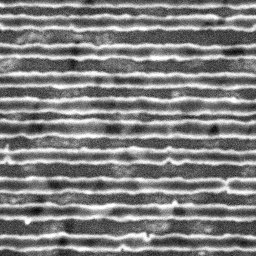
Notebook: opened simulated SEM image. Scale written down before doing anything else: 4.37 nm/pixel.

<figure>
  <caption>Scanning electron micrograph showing parallel lines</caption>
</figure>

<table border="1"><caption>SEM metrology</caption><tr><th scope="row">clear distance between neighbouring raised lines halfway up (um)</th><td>0.06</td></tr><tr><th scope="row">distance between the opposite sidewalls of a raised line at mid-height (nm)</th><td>60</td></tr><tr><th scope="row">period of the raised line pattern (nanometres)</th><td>120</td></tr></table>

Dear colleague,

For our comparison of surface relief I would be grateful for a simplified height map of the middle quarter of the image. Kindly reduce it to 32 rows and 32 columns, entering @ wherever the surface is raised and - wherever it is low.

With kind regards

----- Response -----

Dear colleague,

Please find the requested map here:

--------------------------------
--------------------------------
@@@@@@@@@@@--------@-------@@---
@@@@@@@@@@@@@@@@@@@@@@@@@@@@@@@@
@@@@@@@@@@@@@@@@@@@@@@@@@@@@@@@@
@@@-@----@@@@@@@@@@@@@@@@@@@@@@-
--------------------------------
--------------------------------
-----------@@-----@@----------@@
@@@@@@@@@@@@@@@@@@@@@@@@@@@@@@@@
@@@@@@@@@@@@@@@@@@@@@@@@@@@@@@@@
@@@@@@@@@@@@@@@@@@@@@@@@@@@@@@@@
------------------------------@@
--------------------------------
@@@@@@@@@@@@@@@@-@@--------@-@@@
@@@@@@@@@@@@@@@@@@@@@@@@@@@@@@@@
@@@@@@@@@@@@@@@@@@@@@@@@@@@@@@@@
@@@@@@@@@@@@@@@@@@@@@@@@@@@@@@@@
--------------@-----------------
--------------------------------
--------------------------------
@@--@@-------@@@@@@@@@@---@-----
@@@@@@@@@@@@@@@@@@@@@@@@@@@@@@@@
@@@@@@@@@@@@@@@@@@@@@@@@@@@@@@@@
@@@@@@@@@@---@@@@@---@@@@@-@@@-@
--------------------------------
--------------------------------
--------------------------------
--------@@----------------------
@@@@@@@@@@@@@@@@@@@@@@@@@@@@@@@@
@@@@@@@@@@@@@@@@@@@@@@@@@@@@@@@@
@@@@@@@@@@@@@@@@@@@@@@@@@@@@@@@@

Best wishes